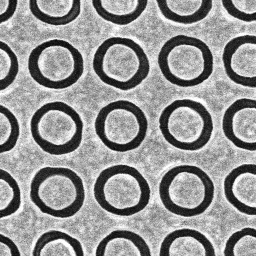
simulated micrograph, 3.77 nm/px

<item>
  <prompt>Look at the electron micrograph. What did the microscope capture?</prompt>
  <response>a regular array of ring-shaped grooves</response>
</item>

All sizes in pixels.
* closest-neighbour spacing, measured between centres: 63.6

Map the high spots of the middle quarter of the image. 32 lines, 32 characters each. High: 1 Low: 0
11000110001111111110001100111111
11000110001111111100011100011111
11000111001111111100011110011111
10001111100011111000111110000111
00011111110000000000111111000000
00111111111100000011111111111000
11111111111111101111111111111111
11111111111111111111111111111111
11111111111111111111111111111111
11111111111100000111111111100000
01111111110000000011111111000000
00011111100001000001111110001111
00011111000111111000111100011111
11001111000111111100011100111111
11000111001111111100011100111111
11100111001111111110011100111111
11100111001111111110011100111111
11100111001111111100111110011111
11001111100111111000111110001111
10001111100011110000111111000011
00001111110000000001111111100000
00011111111100000111111111111100
11111111111111111111111111111111
11111111111111111111111111111111
11111111111111111111111111111111
11111111111100000111111111111000
00111111110000000011111111000000
00011111100000000001111110000111
10001111000011111100111110001111
11000111000111111100011100011111
11000111001111111110011100011111
11100110001111111110001100111111